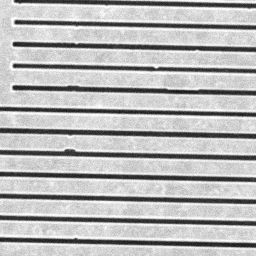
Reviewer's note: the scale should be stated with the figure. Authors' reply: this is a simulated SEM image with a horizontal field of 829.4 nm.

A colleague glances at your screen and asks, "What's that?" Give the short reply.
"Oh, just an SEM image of parallel lines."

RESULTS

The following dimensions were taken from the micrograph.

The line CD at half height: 51.4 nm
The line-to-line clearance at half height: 19.4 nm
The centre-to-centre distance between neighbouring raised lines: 70.4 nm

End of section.